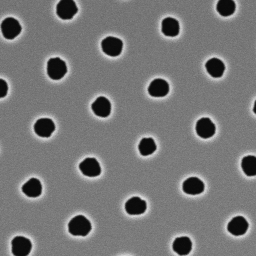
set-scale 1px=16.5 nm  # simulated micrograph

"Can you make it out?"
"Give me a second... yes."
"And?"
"a regular array of holes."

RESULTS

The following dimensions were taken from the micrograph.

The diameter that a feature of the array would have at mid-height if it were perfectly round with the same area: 336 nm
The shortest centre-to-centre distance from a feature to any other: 983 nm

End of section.